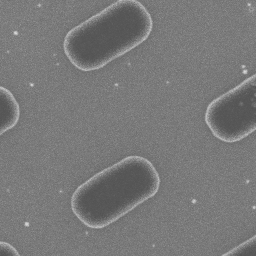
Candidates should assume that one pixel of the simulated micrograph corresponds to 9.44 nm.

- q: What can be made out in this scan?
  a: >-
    raised bodies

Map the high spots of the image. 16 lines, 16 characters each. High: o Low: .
.......oo.......
.....oooo.......
....ooooo.......
....ooo.........
................
...............o
o............ooo
o............ooo
..............o.
................
.......ooo......
.....ooooo......
.....oooo.......
.....ooo........
................
o..............o